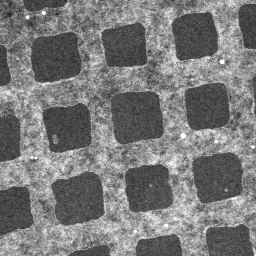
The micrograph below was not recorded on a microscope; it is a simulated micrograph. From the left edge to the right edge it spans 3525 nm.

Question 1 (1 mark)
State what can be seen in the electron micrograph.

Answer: a regular array of raised bodies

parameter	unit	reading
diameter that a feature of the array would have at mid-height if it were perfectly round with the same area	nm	707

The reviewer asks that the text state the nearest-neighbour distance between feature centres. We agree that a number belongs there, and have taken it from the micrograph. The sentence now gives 0.969 microns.